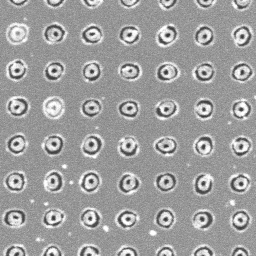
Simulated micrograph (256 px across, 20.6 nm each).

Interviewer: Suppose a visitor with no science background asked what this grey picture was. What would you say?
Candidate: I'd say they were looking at a regular array of ring-shaped grooves with a dot in the middle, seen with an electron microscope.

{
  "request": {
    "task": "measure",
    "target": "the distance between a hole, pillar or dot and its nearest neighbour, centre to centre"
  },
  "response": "0.748 um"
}